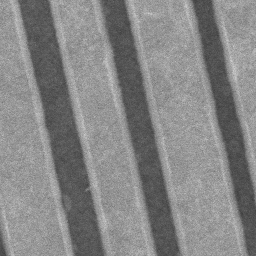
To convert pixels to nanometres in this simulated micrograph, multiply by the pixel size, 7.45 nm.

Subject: one or a few lines or trenches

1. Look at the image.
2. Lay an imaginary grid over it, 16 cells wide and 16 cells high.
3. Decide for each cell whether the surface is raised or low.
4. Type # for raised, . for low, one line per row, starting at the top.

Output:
#..###..####..##
#...##..####..##
#...###..###..##
##..###..###..##
##..###..####.##
##...##..####..#
##...##...###..#
###..###..###..#
###..###..####.#
###..###..####..
###...##..####..
###...###..###..
####..###..###..
####..###..####.
####...##..####.
.###...##..####.